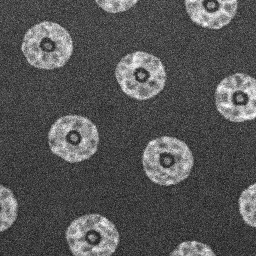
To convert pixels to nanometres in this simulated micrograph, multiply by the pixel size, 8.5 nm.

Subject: ring-shaped raised bodies with a dot in the middle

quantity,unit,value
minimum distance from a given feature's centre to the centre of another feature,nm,769